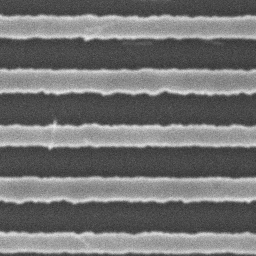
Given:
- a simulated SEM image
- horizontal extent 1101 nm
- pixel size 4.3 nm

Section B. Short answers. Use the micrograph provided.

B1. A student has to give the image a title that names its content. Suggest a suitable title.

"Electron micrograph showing lines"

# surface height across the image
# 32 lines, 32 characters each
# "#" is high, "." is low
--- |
................................
................................
################################
################################
################################
................................
................................
................................
................................
################################
################################
##.##.###...########.###########
................................
................................
................................
................................
################################
################################
................................
................................
................................
................................
################################
################################
################################
................................
................................
................................
................................
################################
################################
##..############################